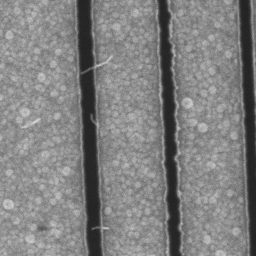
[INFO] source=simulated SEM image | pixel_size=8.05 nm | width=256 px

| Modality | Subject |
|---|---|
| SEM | one or a few lines or trenches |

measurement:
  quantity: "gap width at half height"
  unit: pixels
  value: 64.6